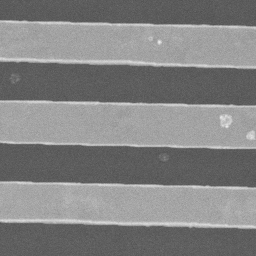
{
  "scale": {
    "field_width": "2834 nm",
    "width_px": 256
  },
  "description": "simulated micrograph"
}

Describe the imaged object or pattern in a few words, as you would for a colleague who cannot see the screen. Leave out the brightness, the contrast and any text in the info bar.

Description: lines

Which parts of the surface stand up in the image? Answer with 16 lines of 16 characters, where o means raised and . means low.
................
ooooooo.........
oooooooooooooooo
oooooooooooooooo
................
................
ooooooooo.......
oooooooooooooooo
oooooooooooooooo
................
................
ooooo...........
oooooooooooooooo
oooooooooooooooo
................
................